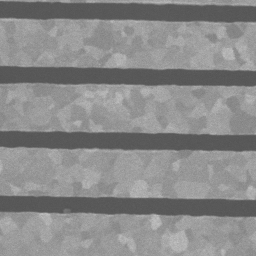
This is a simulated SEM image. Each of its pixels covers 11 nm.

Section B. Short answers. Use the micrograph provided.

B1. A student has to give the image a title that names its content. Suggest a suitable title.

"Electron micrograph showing lines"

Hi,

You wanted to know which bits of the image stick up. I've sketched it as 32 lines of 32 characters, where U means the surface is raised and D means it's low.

DDDDDDDDDDDDDDDDDDDDDDUUUUUUUUUU
DDDDDDDDDDDDDDDDDDDDDDDDDDDDDDDD
UUUUUDUUUUUUUDDDDDDDDDDDDDDDDDDD
UUUUUUUUUUUUUUUUUUUUUUUUUUUUUUUU
UUUUUUUUUUUUUUUUUUUUUUUUUUUUUUUU
UUUUUUUUUUUUUUUUUUUUUUUUUUUUUUUU
UUUUUUUUUUUUUUUUUUUUUUUUUUUUUUUU
UUUUUUUUUUUUUUUUUUUUUUUUUUUUUUUU
DDDDDDDDDDDDDDDUUUUUUUUUUUUUUUUU
DDDDDDDDDDDDDDDDDDDDDDDDDDDDDDDD
DDUUUUDDDDDDDDDDDDDDDDDDDDDDDDDD
UUUUUUUUUUUUUUUUUUUUUUUUUUUUUUUU
UUUUUUUUUUUUUUUUUUUUUUUUUUUUUUUU
UUUUUUUUUUUUUUUUUUUUUUUUUUUUUUUU
UUUUUUUUUUUUUUUUUUUUUUUUUUUUUUUU
UUUUUUUUUUUUUUUUUUUUUUUUUUUUUUUU
DDDDDDDDUDDUDDDUUUUUUUUUUUUUUUUU
DDDDDDDDDDDDDDDDDDDDDDDDDDDDDDDD
UDUDDDDDDDDDDDDDDDDDDDDDDDDDDDDD
UUUUUUUUUUUUUUUUUUUUUUUUUUUUUUUU
UUUUUUUUUUUUUUUUUUUUUUUUUUUUUUUU
UUUUUUUUUUUUUUUUUUUUUUUUUUUUUUUU
UUUUUUUUUUUUUUUUUUUUUUUUUUUUUUUU
UUUUUUUUUUUUUUUUUUUUUUUUUUUUUUUU
DDDDUDUUUUUUUUUUUUUUUUUUUUUUUUUU
DDDDDDDDDDDDDDDDDDDDDDDDDDDDDDDD
DDDDDDDDDDDDDDDDDDDDDDDDDDDDDDDD
UUUUUUUUUUUUUUUUUUUUUUUUUUUUUUUU
UUUUUUUUUUUUUUUUUUUUUUUUUUUUUUUU
UUUUUUUUUUUUUUUUUUUUUUUUUUUUUUUU
UUUUUUUUUUUUUUUUUUUUUUUUUUUUUUUU
UUUUUUUUUUUUUUUUUUUUUUUUUUUUUUUU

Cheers